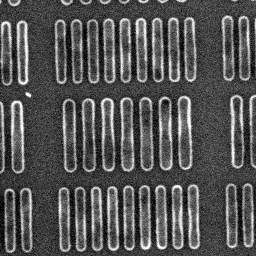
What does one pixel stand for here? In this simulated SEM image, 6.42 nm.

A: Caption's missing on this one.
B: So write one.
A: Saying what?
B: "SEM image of groups of lines, slits or small figures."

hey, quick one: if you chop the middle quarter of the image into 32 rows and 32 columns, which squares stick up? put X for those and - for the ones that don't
--XX--XX--XX--XX--XX--XXX--XX-XX
--XX--XX--XXX-XX---X--XXX--XX--X
--XX--XX--XXX-XXX--X--XXX--XX--X
--XX--XX--XXX-XXX--X--XXX--XX--X
---X---X---X--------------------
--------------------------------
--------------------------------
--------------------------------
-------------------------X---XX-
XX---XX---XX--XXX--XXX--XX---XX-
XXX--XX---XX--XXX--XXX--XX---XX-
XXX--XX---XX--XXX--XXX--XX---XX-
XXX--XX---XX--XXX--XXX--XX---XX-
XXX--XX---XX--XXX--XXX--XX---XX-
XXX--XX---XX---XX--XXX--XX---XX-
XXX--XX---XX---XX--XXX--XX---XX-
XXX--XX---XX---XX--XXX--XX---XX-
XXX--XX---XX---XX--XXX--XX---XXX
XXX--XX---XX--XXX--XXX--XXX--XXX
XXX--XXX--XX--XXX--XXX--XXX--XXX
XXX--XXX--XXX-XXX--XXX--XXX--XXX
XXX--XXX--XXX-XXX--XXX--XXX--XXX
XXX--XXX--XXX-XXX--XXX--XXX--XXX
XXX--XXX--XXX-XXX--XXX--XXX--XXX
XXX--XXX--XXX--XX--XXX--XXX--XXX
XXX--XXX--XXX--XX--XXX--XXX--XXX
-XX---X----X---X----------------
--------------------------------
--------------------------------
--------------------------------
--------------------------------
X--XX--XX--XX--XX--XX--XX--XX--X